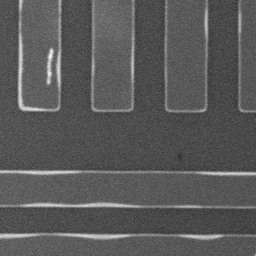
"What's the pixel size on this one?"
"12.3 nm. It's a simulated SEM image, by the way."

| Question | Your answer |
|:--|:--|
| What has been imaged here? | groups of lines, slits or small figures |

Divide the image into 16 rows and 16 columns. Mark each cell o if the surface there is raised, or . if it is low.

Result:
.ooo..oo..ooo..o
.ooo..oo..ooo..o
.ooo..oo..ooo..o
.ooo..oo..ooo..o
.ooo..oo..ooo..o
.ooo..oo..ooo..o
.ooo..oo..ooo..o
................
................
................
................
oooooooooooooooo
oooooooooooooooo
................
................
oooooooooooooooo